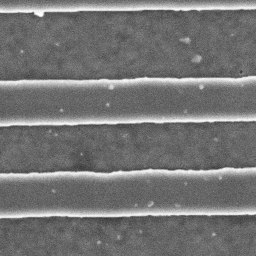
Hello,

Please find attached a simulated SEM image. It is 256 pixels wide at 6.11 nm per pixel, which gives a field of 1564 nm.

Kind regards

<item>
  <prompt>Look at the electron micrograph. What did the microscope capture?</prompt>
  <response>lines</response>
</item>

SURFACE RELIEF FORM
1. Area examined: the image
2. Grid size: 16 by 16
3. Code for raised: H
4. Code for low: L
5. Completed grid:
HHHHHHHHHHHHHHHL
LLLLLLLLLLLLLLLL
LLLLLLLLLLLLLLLL
LLLLLLLLLLLLLLLL
LLLLLLLLLLLLLLLL
HHHHHHHHHHHHHHHH
HHHHHHHHHHHHHHHH
HHHHHHHHHHHHHHHH
LLLLLLLLLLLLLLLL
LLLLLLLLLLLLLLLL
LLLLLLLLLLLLLLLL
HHHHHHHHHHHHHHHH
HHHHHHHHHHHHHHHH
HHHLHHHHLLLLLLLL
LLLLLLLLLLLLLLLL
LLLLLLLLLLLLLLLL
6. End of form